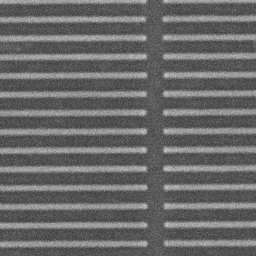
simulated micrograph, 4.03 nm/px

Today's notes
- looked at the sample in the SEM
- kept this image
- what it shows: parallel lines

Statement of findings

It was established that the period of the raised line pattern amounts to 75.4 nanometres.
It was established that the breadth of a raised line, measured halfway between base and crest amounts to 17.6 nm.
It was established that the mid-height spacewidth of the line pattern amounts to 55.9 nanometres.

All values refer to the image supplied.